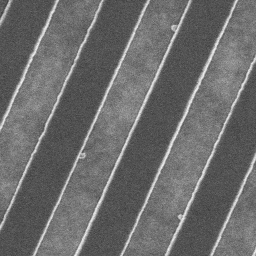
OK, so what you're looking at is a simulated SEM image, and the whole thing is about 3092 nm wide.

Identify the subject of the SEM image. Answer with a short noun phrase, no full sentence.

lines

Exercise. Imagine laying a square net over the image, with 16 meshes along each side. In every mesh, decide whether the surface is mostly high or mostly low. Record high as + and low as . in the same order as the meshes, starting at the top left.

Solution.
+++...+++...+++.
+++...+++..+++..
+++..+++...+++..
++...+++..+++...
++..+++...+++..+
+...+++..+++...+
+..+++...+++...+
...+++..+++...++
...+++..+++...++
..+++...+++..+++
..+++..+++...+++
.+++...+++..+++.
.+++..+++...+++.
+++...+++..+++..
+++..+++...+++..
++...+++...++...